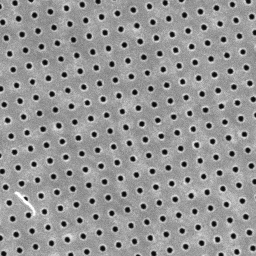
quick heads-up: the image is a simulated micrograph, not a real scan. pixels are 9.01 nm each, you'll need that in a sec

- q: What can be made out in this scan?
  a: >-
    a regular array of holes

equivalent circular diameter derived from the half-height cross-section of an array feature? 5.97 px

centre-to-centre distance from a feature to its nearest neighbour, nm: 145